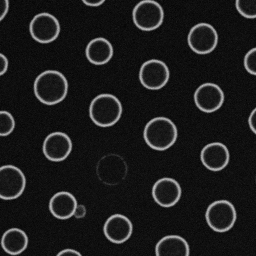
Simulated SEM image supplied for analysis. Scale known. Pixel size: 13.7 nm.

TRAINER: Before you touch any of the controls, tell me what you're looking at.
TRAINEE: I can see a regular array of raised bodies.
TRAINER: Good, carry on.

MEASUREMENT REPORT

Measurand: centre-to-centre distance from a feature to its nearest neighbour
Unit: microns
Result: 0.813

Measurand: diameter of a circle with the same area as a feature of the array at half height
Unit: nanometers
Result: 377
